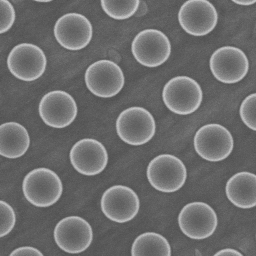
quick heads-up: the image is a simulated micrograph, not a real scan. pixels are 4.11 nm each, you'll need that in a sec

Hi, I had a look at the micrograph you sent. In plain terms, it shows a regular array of raised bodies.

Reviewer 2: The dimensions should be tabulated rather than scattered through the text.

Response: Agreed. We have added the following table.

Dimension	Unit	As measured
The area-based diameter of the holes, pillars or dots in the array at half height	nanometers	150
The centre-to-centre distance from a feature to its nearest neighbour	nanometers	229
